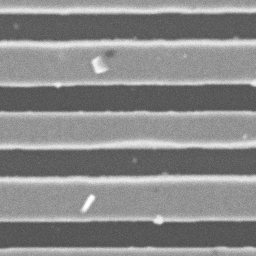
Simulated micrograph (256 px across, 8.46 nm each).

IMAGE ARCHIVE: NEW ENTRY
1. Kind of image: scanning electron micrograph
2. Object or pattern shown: lines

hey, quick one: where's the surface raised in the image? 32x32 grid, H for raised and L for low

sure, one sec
HHHHHHHHHHHHHHHHHHHHHHHHHHHHHHHH
HHHHHHHHHHHHHHHHHHHHHLHHHHHHLLHH
LLLLLLLLLLLLLLLLLLLLLLLLLLLLLLLL
LLLLLLLLLLLLLLLLLLLLLLLLLLLLLLLL
LLLLLLLLLLLLLLLLLLLLLLLLLLLLLLLL
HHHHHHHHHHHHHHHHHHHHHHHHHHHHHHHH
HHHHHHHHHHHHHHHHHHHHHHHHHHHHHHHH
HHHHHHHHHHHHHHHHHHHHHHHHHHHHHHHH
HHHHHHHHHHHHHHHHHHHHHHHHHHHHHHHH
HHHHHHHHHHHHHHHHHHHHHHHHHHHHHHHH
HHHHHHHHHHHHHHHHHHHHHHHHHHLLLLLH
LLLLLLLLLLLLLLLLLLLLLLLLLLLLLLLL
LLLLLLLLLLLLLLLLLLLLLLLLLLLLLLLL
LLLLLLLLLLLLLLLLLLLLLLLLLLLLLLLL
HHHHHHHHHHHHHHHHHHHHHHHHHHHHHHHH
HHHHHHHHHHHHHHHHHHHHHHHHHHHHHHHH
HHHHHHHHHHHHHHHHHHHHHHHHHHHHHHHH
HHHHHHHHHHHHHHHHHHHHHHHHHHHHHHHH
HHHHHHHHHHHHHLLLLLLLLLLLLLLLLLLL
LLLLLLLLLLLLLLLLLLLLLLLLLLLLLLLL
LLLLLLLLLLLLLLLLLLLLLLLLLLLLLLLL
LLLLLLLLLLLLLLLLLLLLLLLLLLLLLLLL
HHHHHHHHHHHHHHHHHHHHHHHHHHHHHHHH
HHHHHHHHHHHHHHHHHHHHHHHHHHHHHHHH
HHHHHHHHHHHHHHHHHHHHHHHHHHHHHHHH
HHHHHHHHHHHHHHHHHHHHHHHHHHHHHHHH
HHHHHHHHHHHHHHHHHHHHHHHHHHHHHHHH
HHHHHHHHHHHHHHHHHHHHHHHHHHHHHHHH
LLLLLLLLLLLLLLLLLLLLLLLLLLLLLLLL
LLLLLLLLLLLLLLLLLLLLLLLLLLLLLLLL
LLLLLLLLLLLLLLLLLLLLLLLLLLLLLLLL
HHHHHHHHHHHHHHHHHHHHHHHHHHHHHHHH